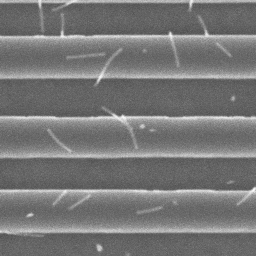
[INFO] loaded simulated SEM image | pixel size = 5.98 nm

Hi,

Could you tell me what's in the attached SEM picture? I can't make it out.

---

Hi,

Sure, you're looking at lines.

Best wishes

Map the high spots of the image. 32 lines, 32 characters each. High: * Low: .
................................
................................
................................
................................
.......*.............*...*......
********************************
********************************
********************************
********************************
********************************
................................
................................
................................
................................
................................
********************************
********************************
********************************
********************************
****....*******..........*......
................................
................................
................................
................................
********************************
********************************
********************************
********************************
********************************
................................
................................
................................